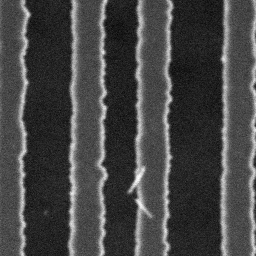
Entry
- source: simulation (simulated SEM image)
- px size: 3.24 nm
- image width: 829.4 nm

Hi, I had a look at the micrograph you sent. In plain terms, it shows lines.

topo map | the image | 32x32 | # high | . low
###......####....#####......####
###......####....####.......####
###......####....####.......####
###......####....####.......####
###......####....####.......####
###......####....####.......####
###......####....####.......####
###......####....####.......####
###......####....####.......####
###......####....####.......####
###......####....####.......####
###......####....####.......####
###......####....####.......####
###......####....####.......####
###......####....####.......####
###......####....####.......####
###......####....####.......####
###......####....####.......####
###......####....####.......####
###......####....####.......####
###......####....####.......####
###......####....####.......####
###......####....####.......####
###......####....####.......####
###......####....####.......####
###......####....####.......####
###......####....####.......####
###......####....####.......####
###......####....####.......####
###......####....####.......####
###......####....####.......####
###......####....####.......####